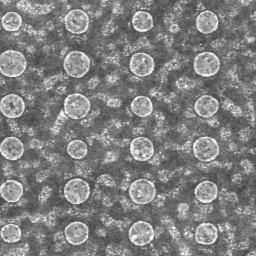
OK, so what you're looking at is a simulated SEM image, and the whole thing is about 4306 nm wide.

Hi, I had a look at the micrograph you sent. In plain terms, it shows a regular array of raised bodies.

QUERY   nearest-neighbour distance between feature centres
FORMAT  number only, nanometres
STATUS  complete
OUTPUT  706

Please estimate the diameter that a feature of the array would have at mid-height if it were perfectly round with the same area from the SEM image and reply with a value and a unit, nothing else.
379 nanometers